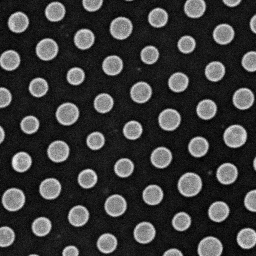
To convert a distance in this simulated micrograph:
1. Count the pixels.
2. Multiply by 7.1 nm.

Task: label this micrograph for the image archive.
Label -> a regular array of raised bodies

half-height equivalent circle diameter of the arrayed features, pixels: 19.9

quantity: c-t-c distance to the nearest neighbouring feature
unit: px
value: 38.2